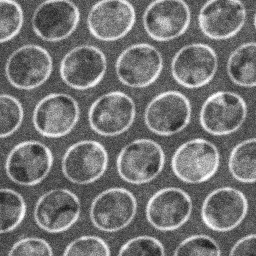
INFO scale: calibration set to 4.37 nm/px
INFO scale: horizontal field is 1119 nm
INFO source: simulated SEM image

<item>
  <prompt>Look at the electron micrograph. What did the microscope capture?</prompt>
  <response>a regular array of raised bodies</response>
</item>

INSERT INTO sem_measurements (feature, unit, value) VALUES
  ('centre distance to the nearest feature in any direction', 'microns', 0.24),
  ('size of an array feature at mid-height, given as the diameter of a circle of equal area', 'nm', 184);